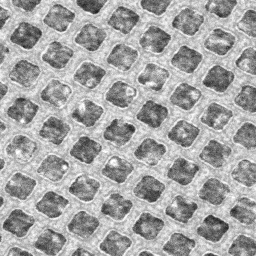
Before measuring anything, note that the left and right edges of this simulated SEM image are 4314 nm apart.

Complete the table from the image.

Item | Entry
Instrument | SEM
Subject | a regular array of holes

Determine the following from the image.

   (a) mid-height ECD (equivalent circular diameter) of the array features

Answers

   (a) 475 nm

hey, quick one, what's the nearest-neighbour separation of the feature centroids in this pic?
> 623 nanometers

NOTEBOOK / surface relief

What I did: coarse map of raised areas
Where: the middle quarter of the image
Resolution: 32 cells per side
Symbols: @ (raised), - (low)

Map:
-@@@-----@@@-----@@@----@@@-----
@@@-------@@@@--@@@@------@@@---
@@--------@@@@@@@@@--------@@@@@
@@--------@@@@@@@@--------@@@@@@
@@@------@@@@--@@@@-------@@@@@@
--@@@---@@@@-----@@@-----@@@----
--@@@@@@@@@-------@@@@--@@@-----
--@@@@@@@@--------@@@@@@@@@-----
-@@@@@@@@@--------@@@@@@@@------
-@@@---@@@@------@@@---@@@@-----
@@@------@@@@---@@@------@@@----
@@--------@@@@@@@@@-------@@@@--
@@--------@@@@@@@@--------@@@@@@
@@-------@@@@@@@@@--------@@@@@@
@@@-----@@@@----@@@------@@@---@
-@@@@--@@@@-------@@@---@@@-----
--@@@@@@@@--------@@@@@@@@@-----
-@@@@@@@@@-------@@@@@@@@@------
@@@@--@@@@-------@@@@@@@@@------
@@@------@@@----@@@-----@@@-----
@@--------@@@--@@@@------@@@@---
@--------@@@@@@@@@--------@@@@@@
@--------@@@@@@@@--------@@@@@@@
@@@-----@@@----@@@-------@@@@-@@
-@@@---@@@@------@@@----@@@-----
-@@@@@@@@@--------@@@@@@@@@-----
-@@@@@@@@--------@@@@@@@@@------
@@@@-@@@@--------@@@@@@@@@------
@@@----@@@@-----@@@----@@@------
@@-------@@@@--@@@@------@@@----
@--------@@@@@@@@@-------@@@@@@@
@--------@@@@@@@@--------@@@@@@@